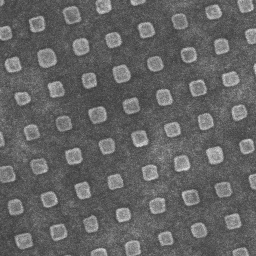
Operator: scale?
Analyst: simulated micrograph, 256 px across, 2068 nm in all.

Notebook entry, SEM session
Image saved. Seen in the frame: a regular array of raised bodies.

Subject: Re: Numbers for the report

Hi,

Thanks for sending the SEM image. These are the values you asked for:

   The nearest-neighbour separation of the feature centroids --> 271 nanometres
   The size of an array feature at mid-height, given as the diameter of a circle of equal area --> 0.124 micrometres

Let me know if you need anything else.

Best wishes